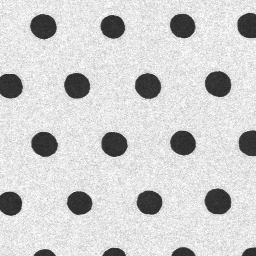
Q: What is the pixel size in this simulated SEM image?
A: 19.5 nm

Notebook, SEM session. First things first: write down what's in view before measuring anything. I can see a regular array of holes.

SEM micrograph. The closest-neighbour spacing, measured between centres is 1.32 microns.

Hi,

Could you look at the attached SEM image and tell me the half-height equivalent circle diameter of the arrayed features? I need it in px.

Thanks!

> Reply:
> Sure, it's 25.5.